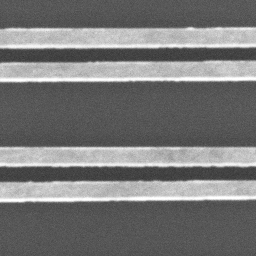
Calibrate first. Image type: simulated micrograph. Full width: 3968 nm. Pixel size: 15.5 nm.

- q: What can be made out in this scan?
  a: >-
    lines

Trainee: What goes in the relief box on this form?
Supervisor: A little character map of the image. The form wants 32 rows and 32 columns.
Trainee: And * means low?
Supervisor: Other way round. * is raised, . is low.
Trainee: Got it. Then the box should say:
................................
................................
................................
................................
********************************
********************************
................................
................................
********************************
********************************
................................
................................
................................
................................
................................
................................
................................
................................
................................
********************************
********************************
................................
................................
********************************
********************************
................................
................................
................................
................................
................................
................................
................................